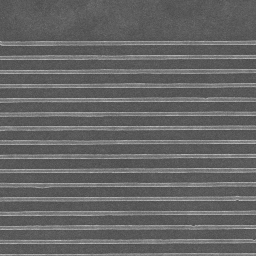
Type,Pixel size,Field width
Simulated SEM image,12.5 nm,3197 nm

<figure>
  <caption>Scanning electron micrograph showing parallel lines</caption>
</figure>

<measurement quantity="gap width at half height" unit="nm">131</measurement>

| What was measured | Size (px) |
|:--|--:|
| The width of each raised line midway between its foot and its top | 3.75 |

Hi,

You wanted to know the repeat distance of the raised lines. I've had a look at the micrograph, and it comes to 14.2 px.